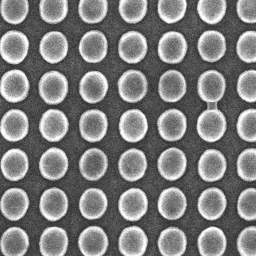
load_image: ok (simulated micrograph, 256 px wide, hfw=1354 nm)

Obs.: a regular array of raised bodies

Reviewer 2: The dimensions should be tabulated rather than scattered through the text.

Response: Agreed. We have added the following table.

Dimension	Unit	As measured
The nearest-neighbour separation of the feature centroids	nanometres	205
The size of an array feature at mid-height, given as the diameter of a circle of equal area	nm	153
